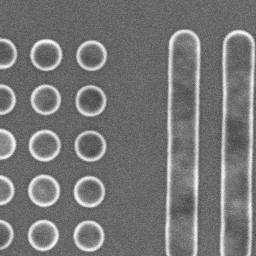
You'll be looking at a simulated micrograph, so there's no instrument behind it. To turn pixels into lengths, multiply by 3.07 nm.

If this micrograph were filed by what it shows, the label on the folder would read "groups of lines, slits or small figures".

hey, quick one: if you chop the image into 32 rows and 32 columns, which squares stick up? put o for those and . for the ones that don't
................................
................................
................................
................................
......................ooo....oo.
o....oo...oo.........oooo...oooo
oo..oooo..ooo........oooo...oooo
oo..oooo..ooo........oooo...oooo
.....oo....o.........oooo...oooo
.....................oooo...oooo
.....................oooo...oooo
o...ooo...ooo........oooo...oooo
oo..ooo...ooo........oooo...ooo.
o...ooo...ooo........oooo...ooo.
.....................oooo...ooo.
.....................oooo...ooo.
o....o.....o.........oooo...ooo.
oo..ooo...ooo........oooo...ooo.
oo..ooo...ooo........oooo...ooo.
o...ooo...ooo........oooo...ooo.
.....................oooo...ooo.
.....................oooo...ooo.
o...ooo...oo.........oooo...ooo.
oo..ooo..oooo........oooo...ooo.
o...ooo..oooo........oooo...ooo.
.....o....oo.........oooo...ooo.
.....................oooo...ooo.
.....................oooo...ooo.
o...ooo...ooo........oooo...ooo.
o...ooo..oooo........oooo...ooo.
o...ooo...ooo........oooo...ooo.
.....................oooo...ooo.